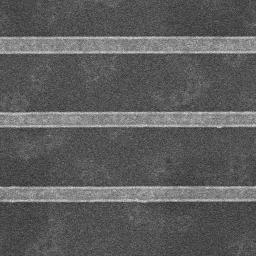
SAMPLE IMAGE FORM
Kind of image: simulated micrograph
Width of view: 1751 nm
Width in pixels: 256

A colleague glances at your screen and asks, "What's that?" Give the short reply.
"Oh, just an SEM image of one or a few lines or trenches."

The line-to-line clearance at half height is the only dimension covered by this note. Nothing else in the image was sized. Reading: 414 nm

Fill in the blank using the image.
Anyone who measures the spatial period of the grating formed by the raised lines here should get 510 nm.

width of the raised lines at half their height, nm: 96.6